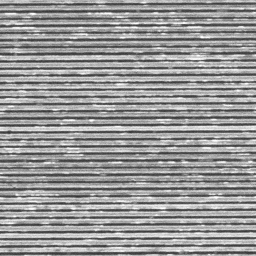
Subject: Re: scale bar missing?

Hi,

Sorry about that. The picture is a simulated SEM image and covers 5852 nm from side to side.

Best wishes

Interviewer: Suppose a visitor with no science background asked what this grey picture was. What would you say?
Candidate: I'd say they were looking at parallel lines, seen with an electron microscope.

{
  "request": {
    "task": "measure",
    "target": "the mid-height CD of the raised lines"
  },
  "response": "0.106 um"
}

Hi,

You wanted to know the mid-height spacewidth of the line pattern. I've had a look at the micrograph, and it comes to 65.7 nm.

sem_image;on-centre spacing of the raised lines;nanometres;162